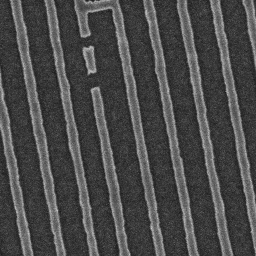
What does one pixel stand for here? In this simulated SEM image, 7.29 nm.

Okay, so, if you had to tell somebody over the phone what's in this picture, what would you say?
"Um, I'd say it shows parallel lines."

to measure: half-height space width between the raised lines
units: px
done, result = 23.9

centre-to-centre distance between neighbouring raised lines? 238 nm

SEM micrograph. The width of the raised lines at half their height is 9.23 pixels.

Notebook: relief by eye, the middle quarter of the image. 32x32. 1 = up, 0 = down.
00000011000000011000000110000001
00000011000000011000000110000001
00000000000000011000000110000000
10000000000000011100000111000000
10000000000000011100000011000000
10000000000000001100000011000000
10000001100000001100000011000000
11000001100000001100000011000000
10000001100000001100000011100000
11000001110000001110000001100000
11000001110000001110000001100000
11000000110000001110000001100000
11000000110000000110000001100000
11100000110000000110000001100000
01100000110000000110000001110000
01100000111000000110000000110000
01100000111000000111000000110000
01100000011000000011000000110000
01100000011000000011000000110000
01110000011000000011000000110000
01110000011100000011000000011000
00110000011100000011100000011000
00110000001100000011100000011000
00110000001100000001100000011000
00110000001100000001100000011000
00011000001110000001100000011100
00011000001110000001100000011100
00011000001110000001110000001100
00011000001110000001110000001100
00011000000110000000110000001100
00001100000111000000110000001110
00001100000111000000110000001110